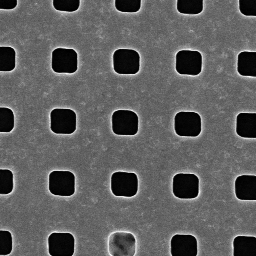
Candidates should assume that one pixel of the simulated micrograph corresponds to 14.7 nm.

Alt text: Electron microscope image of a regular array of holes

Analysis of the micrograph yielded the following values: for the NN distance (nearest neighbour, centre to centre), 899 nm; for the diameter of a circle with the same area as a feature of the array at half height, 407 nanometers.